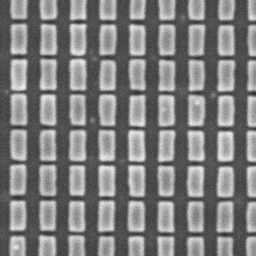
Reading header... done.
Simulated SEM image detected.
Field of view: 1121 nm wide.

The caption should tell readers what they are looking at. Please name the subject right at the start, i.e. groups of lines, slits or small figures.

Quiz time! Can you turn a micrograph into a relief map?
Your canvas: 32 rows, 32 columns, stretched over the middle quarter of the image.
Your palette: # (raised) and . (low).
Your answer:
..###....####....###....####...#
..###....####....###....####...#
..###....####....###....####...#
..###....####....###....###.....
..###....####....###....###.....
..###....####....###....####...#
........................#.#.....
................................
..###....####....###....###....#
..###....####....###....###....#
..###....####....###....###....#
..###....####....###....###....#
..###....####....###....###....#
..###....####....###....###....#
..###....####....###....###....#
................................
................................
..###....####...####....####...#
..###....####...####....####...#
..###....####...####....###....#
..###....####...####....###....#
..###....####...####....###....#
..###....####...####....###....#
..###....####...####....###....#
................................
................................
..###....####...####....###....#
..###....####....###....###....#
..###....####...####....###....#
..###....####...####....###....#
..###....####...####....###....#
..###....####....###....###....#